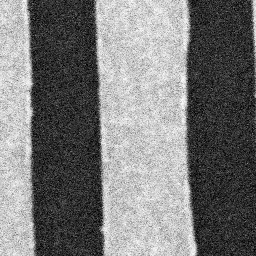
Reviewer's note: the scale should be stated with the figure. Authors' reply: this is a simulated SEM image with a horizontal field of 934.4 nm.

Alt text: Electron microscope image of one or a few lines or trenches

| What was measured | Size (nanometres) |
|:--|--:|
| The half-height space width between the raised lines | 254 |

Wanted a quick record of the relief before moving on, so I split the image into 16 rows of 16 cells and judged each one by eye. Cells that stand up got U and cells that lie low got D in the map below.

UUDDDDUUUUUUDDDD
UUDDDDUUUUUUDDDD
UUDDDDUUUUUUDDDD
UUDDDDUUUUUUDDDD
UUDDDDUUUUUUDDDD
UUDDDDUUUUUUDDDD
UUDDDDUUUUUUDDDD
UUDDDDUUUUUUDDDD
UUDDDDUUUUUUDDDD
UUDDDDUUUUUUDDDD
UUDDDDUUUUUUDDDD
UUDDDDUUUUUUDDDD
UUDDDDDUUUUUDDDD
UUDDDDDUUUUUDDDD
UUDDDDUUUUUUDDDD
UUDDDDDUUUUUDDDD